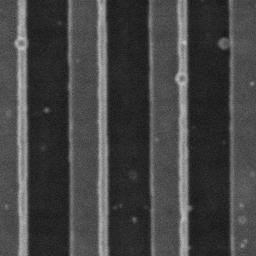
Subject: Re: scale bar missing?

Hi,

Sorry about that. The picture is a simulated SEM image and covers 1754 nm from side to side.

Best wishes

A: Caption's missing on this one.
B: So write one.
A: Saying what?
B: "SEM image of lines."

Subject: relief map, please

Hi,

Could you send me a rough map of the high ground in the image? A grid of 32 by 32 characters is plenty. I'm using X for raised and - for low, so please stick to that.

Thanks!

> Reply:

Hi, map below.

XXX------XXXX------XXXX------XXX
XXX------XXXX------XXXX------XXX
XXX------XXXX------XXXX------XXX
XXX------XXXX------XXXX------XXX
XXX------XXXX------XXXX------XXX
XXX------XXXX------XXXX------XXX
XXX------XXXX------XXXX------XXX
XXX------XXXX------XXXX------XXX
XXX------XXXX------XXXX------XXX
XXX------XXXX------XXXX------XXX
XXX------XXXX------XXXX------XXX
XXX------XXXX------XXXX------XXX
XXX------XXXX------XXXX------XXX
XXX------XXXX------XXXX------XXX
XXX------XXXX------XXXX------XXX
XXX------XXXX------XXXX------XXX
XXX------XXXX------XXXX------XXX
XXX------XXXX------XXXX------XXX
XXX------XXXX------XXXX------XXX
XXX------XXXX------XXXX------XXX
XXX------XXXX------XXXX------XXX
XXX------XXXX------XXXX------XXX
XXX------XXXX------XXXX------XXX
XXX------XXXX------XXXX------XXX
XXX------XXXX------XXXX------XXX
XXX------XXXX------XXXX------XXX
XXX------XXXX------XXXX------XXX
XXX------XXXX------XXXX------XXX
XXX------XXXX------XXXX------XXX
XXX------XXXX------XXXX------XXX
XXX------XXXX------XXXX------XXX
XXX------XXXX------XXXX------XXX